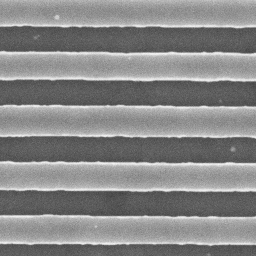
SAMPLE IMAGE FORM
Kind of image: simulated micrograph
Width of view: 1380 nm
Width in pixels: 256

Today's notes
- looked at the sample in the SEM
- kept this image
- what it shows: lines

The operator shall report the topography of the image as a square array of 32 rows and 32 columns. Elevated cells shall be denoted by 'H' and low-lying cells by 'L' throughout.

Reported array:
HHHHHHHHHHHHHHHHHHHHHHHHHHHHHHHH
HHHHHHHHHHHHHHHHHHHHHHHHHHHHHHHH
HHHHHHHHHHHHHHHHHHHHHHHHHHHHHHHH
LLLLLLLLLLLLLLLLLLLLLLLLLLLLLLLL
LLLLLLLLLLLLLLLLLLLLLLLLLLLLLLLL
LLLLLLLLLLLLLLLLLLLLLLLLLLLLLLLL
LLLLLLLLLLLLLLLLLLLLLLLLLLLLLLLL
HHHHHHHHHHHHHHHHHHHHHHHHHHHHHHHH
HHHHHHHHHHHHHHHHHHHHHHHHHHHHHHHH
HHHHHHHHHHHHHHHHHHHHHHHHHHHHHHHH
LLLLLLLLLLLLLLLLLLLLLLLLLLLLLLLL
LLLLLLLLLLLLLLLLLLLLLLLLLLLLLLLL
LLLLLLLLLLLLLLLLLLLLLLLLLLLLLLLL
HHHHHHHHHHHHHHHHHHHHHHHHHHHHHHHH
HHHHHHHHHHHHHHHHHHHHHHHHHHHHHHHH
HHHHHHHHHHHHHHHHHHHHHHHHHHHHHHHH
HHHHHHHHHHHHHHHHHHHHHHHHHHHHHHHH
LLLLLLLLLLLLLLLLLLLLLLLLLLLLLLLL
LLLLLLLLLLLLLLLLLLLLLLLLLLLLLLLL
LLLLLLLLLLLLLLLLLLLLLLLLLLLLLLLL
HHHHHHHHHHHHHHHHHHHHHHHHHHHHHHHH
HHHHHHHHHHHHHHHHHHHHHHHHHHHHHHHH
HHHHHHHHHHHHHHHHHHHHHHHHHHHHHHHH
HHHHHHHHHHHHHHHHHHHHHHHHHHHHHHHH
LLLLLLLLLLLLLLLLLLLLLLLLLLLLLLLL
LLLLLLLLLLLLLLLLLLLLLLLLLLLLLLLL
LLLLLLLLLLLLLLLLLLLLLLLLLLLLLLLL
HHHHHHHHHHHHHHHHHHHHHHHHHHHHHHHH
HHHHHHHHHHHHHHHHHHHHHHHHHHHHHHHH
HHHHHHHHHHHHHHHHHHHHHHHHHHHHHHHH
LLLHHLLHLLHHHHHLLLLHLLHLHHHHHHHH
LLLLLLLLLLLLLLLLLLLLLLLLLLLLLLLL